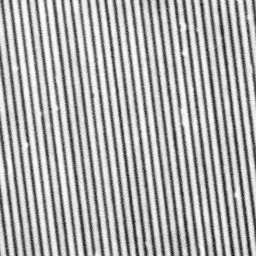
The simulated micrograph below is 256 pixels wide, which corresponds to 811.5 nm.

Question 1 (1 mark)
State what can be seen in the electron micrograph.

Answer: parallel lines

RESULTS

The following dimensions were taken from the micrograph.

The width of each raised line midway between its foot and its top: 12.6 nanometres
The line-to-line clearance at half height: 12.6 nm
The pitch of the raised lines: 27.2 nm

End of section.